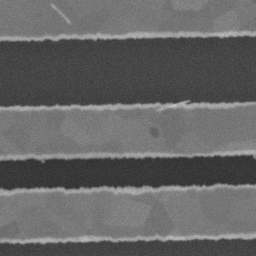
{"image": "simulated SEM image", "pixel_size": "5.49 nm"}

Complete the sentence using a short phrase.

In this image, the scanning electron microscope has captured lines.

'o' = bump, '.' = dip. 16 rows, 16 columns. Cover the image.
oooooooooooooooo
oooooooooooooooo
.o..............
................
................
................
...........oo.oo
oooooooooooooooo
oooooooooooooooo
oooooooooooooooo
................
................
oooooooooooooooo
oooooooooooooooo
oooooooooooooooo
................